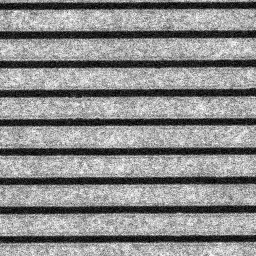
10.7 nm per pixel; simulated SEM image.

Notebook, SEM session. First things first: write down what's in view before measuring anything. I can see parallel lines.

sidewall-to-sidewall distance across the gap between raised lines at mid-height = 84.2 nanometres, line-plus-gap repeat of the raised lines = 312 nm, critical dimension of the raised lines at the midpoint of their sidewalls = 228 nanometres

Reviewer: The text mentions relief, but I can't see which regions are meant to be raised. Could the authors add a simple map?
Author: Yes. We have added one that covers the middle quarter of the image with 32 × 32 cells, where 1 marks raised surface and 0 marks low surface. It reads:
00000000000000000000000000000000
11111111111111111111111111111111
11111111111111111111111111111111
11111111111111111111111111111111
11111111111111111111111111111111
11111111111111111111111111111111
00000000000000000000000000000000
00000000000000000000000000000000
00001110000001111111111111111111
11111111111111111111111111111111
11111111111111111111111111111111
11111111111111111111111111111111
11111111111111111111111111111111
11101111011000000000000000000000
00000000000000000000000000000000
00000000000000000000000000000000
11111111111111111111111111111111
11111111111111111111111111111111
11111111111111111111111111111111
11111111111111111111111111111111
11111111111111111111111111111111
00000000000000000000000000000000
00000000000000000000000000000000
11111111111111111111111111111111
11111111111111111111111111111111
11111111111111111111111111111111
11111111111111111111111111111111
11111111111111111111111111111111
00000000000000000000000000000000
00000000000000000000000000000000
00000000000000000000111111111111
11111111111111111111111111111111